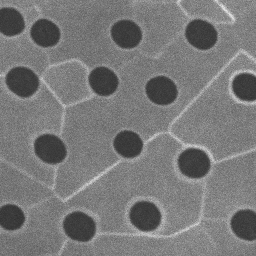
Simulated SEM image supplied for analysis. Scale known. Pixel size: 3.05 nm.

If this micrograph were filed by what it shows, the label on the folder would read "a regular array of holes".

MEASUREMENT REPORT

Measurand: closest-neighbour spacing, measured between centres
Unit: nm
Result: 192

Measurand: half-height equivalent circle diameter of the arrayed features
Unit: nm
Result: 94.9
